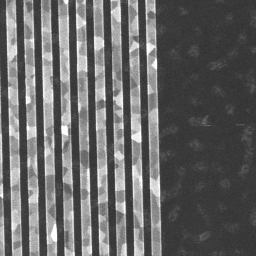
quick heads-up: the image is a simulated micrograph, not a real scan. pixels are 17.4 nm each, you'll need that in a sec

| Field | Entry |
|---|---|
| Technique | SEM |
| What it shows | parallel lines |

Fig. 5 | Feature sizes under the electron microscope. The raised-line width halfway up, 161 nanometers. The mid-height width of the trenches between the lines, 141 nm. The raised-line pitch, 0.303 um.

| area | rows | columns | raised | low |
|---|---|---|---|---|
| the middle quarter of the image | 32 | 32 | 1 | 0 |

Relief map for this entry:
10011100110011000010011000000000
10001100110011000110011000000000
10001100110011000110011000000000
10001100110011000110011000000000
10001100110011000110011000000000
10001100110011000110011000000000
10001100110011000110011000000000
10001100110011000110011000000000
10001100110001000110011000000000
10001100110001000110011000000000
10001100110001100110011000000000
11001100110001100110011000000000
11001100110001100110011000000000
11001100110001100110011000000000
11001100110001100110011000000000
11001100110001100110011000000000
11001100110001100110011000000000
11001100110001100110011000000000
11001100110001100110011000000000
11001100110001100110011000000000
11001100110001100110011000000000
11001100110001100110001000000000
11001100010001100110001000000000
11001100010001100110001100000000
11001100011001100110001100000000
11001100011001100110001100000000
11000000011001100110001100000000
11001000011001100110001100000000
11001100011001100100001100000000
11001100011001100110001100000000
11001100011001100110001100000000
11001100011001100110001100000000